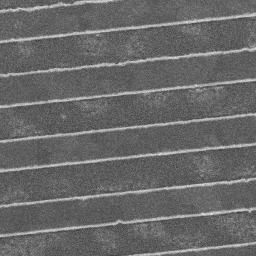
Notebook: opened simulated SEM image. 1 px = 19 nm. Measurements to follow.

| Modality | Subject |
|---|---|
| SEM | one or a few lines or trenches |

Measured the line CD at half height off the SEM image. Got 30.6 px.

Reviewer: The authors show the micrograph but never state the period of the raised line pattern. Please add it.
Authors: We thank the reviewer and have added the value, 1220 nanometers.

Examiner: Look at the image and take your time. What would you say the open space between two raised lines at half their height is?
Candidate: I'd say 636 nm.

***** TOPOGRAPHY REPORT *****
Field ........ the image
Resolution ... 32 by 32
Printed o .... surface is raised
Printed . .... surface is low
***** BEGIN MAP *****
.........ooooooooooooooooooooooo
oooooooooooooooooooooooooooooooo
oooooooooooooooooooooooooo......
ooooooooooooooooo...............
oooooooo........................
................................
............................oooo
...................ooooooooooooo
..........oooooooooooooooooooooo
oooooooooooooooooooooooooooooooo
ooooooooooooooooooooooooooo.....
oooooooooooooooooo..............
ooooooooo.......................
................................
..............................oo
.....................ooooooooooo
...........ooooooooooooooooooooo
..oooooooooooooooooooooooooooooo
ooooooooooooooooooooooooooo.....
oooooooooooooooooo..............
oooooooo........................
................................
...............................o
.....................ooooooooooo
............oooooooooooooooooooo
..oooooooooooooooooooooooooooooo
oooooooooooooooooooooooooooo....
ooooooooooooooooooo.............
oooooooooo......................
................................
...............................o
.....................ooooooooooo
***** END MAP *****